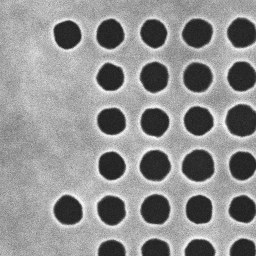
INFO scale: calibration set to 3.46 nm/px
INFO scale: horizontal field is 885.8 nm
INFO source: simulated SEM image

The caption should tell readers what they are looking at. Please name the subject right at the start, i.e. a regular array of holes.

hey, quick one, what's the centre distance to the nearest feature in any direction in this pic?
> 150 nm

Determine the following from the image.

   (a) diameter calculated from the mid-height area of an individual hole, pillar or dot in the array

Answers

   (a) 99.9 nm